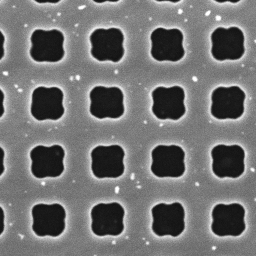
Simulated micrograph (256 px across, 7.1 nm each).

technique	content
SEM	a regular array of holes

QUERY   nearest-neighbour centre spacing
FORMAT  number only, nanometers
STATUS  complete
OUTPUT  413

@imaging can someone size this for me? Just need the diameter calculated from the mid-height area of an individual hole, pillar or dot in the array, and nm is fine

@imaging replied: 252